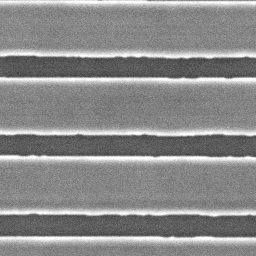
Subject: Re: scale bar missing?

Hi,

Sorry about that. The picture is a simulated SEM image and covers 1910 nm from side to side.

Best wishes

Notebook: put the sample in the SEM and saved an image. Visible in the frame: lines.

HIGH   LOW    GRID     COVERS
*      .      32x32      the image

********************************
********************************
********************************
********************************
********************************
********************************
********************************
................................
................................
................................
********************************
********************************
********************************
********************************
********************************
********************************
********************************
................................
................................
................................
********************************
********************************
********************************
********************************
********************************
********************************
********************************
................................
................................
................................
********************************
********************************